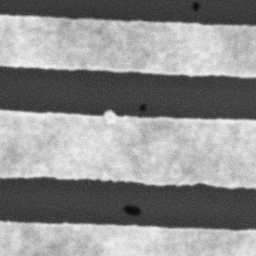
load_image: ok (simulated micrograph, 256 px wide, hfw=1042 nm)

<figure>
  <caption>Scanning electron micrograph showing lines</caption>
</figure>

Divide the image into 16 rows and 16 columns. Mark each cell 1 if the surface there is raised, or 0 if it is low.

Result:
0000000000000000
1111111111110000
1111111111111111
1111111111111111
0000000001111111
0000000000000000
0000000000000000
1111111111110000
1111111111111111
1111111111111111
1111111111111111
0000000000110111
0000000000000000
0000000000000000
1111111111111111
1111111111111111